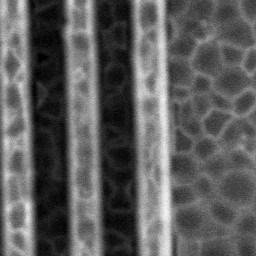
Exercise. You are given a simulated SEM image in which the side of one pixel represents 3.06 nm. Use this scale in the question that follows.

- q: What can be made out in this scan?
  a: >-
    one or a few lines or trenches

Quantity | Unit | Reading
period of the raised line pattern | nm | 207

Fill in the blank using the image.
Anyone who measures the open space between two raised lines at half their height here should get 122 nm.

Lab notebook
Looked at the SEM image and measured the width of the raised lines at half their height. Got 27.5 pixels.